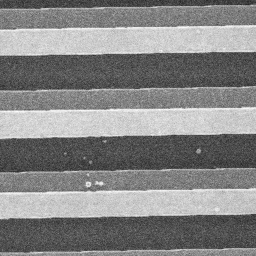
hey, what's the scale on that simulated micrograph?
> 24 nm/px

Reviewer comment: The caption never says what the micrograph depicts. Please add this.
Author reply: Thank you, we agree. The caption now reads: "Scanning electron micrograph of lines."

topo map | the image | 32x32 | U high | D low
DDDDDDDDDDDDDDDDDDDDDDDDDDDDDDDD
UUUUUUUUUUUUUUUUUUUUUUUUUUUUUUUU
UUUUUUUUUUUUUUUUUUUUUUUUUUUUUUUU
UUUUUUUUUUUUUUUUUUUUUUUUUUUUUUUU
UUUUUUUUUUUUUUUUUUUUUUUUUUUUUUUU
UUUUUUUUUUUUUUUUUUUUUUUUUUUUUUUU
UUUUUUUUUUUUUUUUUUUUUUUUUDDDDDDD
DDDDDDDDDDDDDDDDDDDDDDDDDDDDDDDD
DDDDDDDDDDDDDDDDDDDDDDDDDDDDDDDD
DDDDDDDDDDDDDDDDDDDDDDDDDDDDDDDD
DDDDDDDDDDDDDDDDDDDDDDDDDDDDDDDD
UUUUUUUUUUUUUUUUUUUUUUUUUUUUUUUU
UUUUUUUUUUUUUUUUUUUUUUUUUUUUUUUU
UUUUUUUUUUUUUUUUUUUUUUUUUUUUUUUU
UUUUUUUUUUUUUUUUUUUUUUUUUUUUUUUU
UUUUUUUUUUUUUUUUUUUUUUUUUUUUUUUU
UUUUUUUUUUUUUUUUUUUUUUUUUUUUUUUU
DDDDDDDDDDDDDDDDDDDDDDDDDDDDDDDD
DDDDDDDDDDDDDDDDDDDDDDDDDDDDDDDD
DDDDDDDDDDDDDDDDDDDDDDDDDDDDDDDD
DDDDDDDDDDDDDDDDDDDDDDDDDDDDDDDD
DDDDDDDDDUUUUUUUUUUUUUUUUUUUUUUU
UUUUUUUUUUUUUUUUUUUUUUUUUUUUUUUU
UUUUUUUUUUUUUUUUUUUUUUUUUUUUUUUU
UUUUUUUUUUUUUUUUUUUUUUUUUUUUUUUU
UUUUUUUUUUUUUUUUUUUUUUUUUUUUUUUU
UUUUUUUUUUUUUUUUUUUUUUUUUUUUUUUU
DDDDDDDDDDDDDDDDDDDDDDDDDDDDDDDD
DDDDDDDDDDDDDDDDDDDDDDDDDDDDDDDD
DDDDDDDDDDDDDDDDDDDDDDDDDDDDDDDD
DDDDDDDDDDDDDDDDDDDDDDDDDDDDDDDD
DDDDDDDDDDDUUUUUUUUUUUUUUUUUUUUU